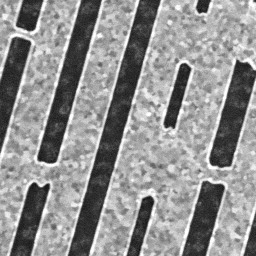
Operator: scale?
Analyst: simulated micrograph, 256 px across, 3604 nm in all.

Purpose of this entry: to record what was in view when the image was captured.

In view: parallel lines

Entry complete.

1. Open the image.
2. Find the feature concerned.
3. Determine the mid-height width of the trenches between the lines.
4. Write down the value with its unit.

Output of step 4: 319 nm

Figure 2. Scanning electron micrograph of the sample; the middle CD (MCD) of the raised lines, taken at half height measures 0.471 um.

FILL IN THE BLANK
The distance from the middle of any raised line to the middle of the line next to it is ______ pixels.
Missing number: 55.3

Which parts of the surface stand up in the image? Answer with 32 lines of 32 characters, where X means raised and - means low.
XXX--XXXXX---XXXX---XXXX--XXXXXX
XX---XXXXX--XXXXX---XXXXX-XXXXXX
XX---XXXX---XXXXX---XXXXXXXXXXXX
XX---XXXX---XXXX---XXXXXXXXXXXXX
XXXXXXXXX---XXXX---XXXXXXXXXXXXX
X---XXXX---XXXXX---XXXXXXXXXXXXX
X---XXXX---XXXX---XXXXXXXXXXXXXX
X---XXXX---XXXX---XXXXXXXXXXX-XX
---XXXXX---XXXX---XXXX--XXXXX---
---XXXX---XXXXX---XXXX--XXXXX---
---XXXX---XXXX---XXXXX--XXXXX---
--XXXXX---XXXX---XXXX--XXXXX----
--XXXX---XXXXX---XXXX--XXXXX---X
--XXXX---XXXX---XXXXX--XXXXX---X
--XXXX---XXXX---XXXX--XXXXX----X
-XXXXX---XXXX---XXXX--XXXXX----X
-XXXX---XXXXX---XXXXXXXXXXX---XX
-XXXX---XXXX---XXXXXXXXXXXX---XX
XXXXX---XXXX---XXXXXXXXXXX----XX
XXXXX--XXXXX---XXXXXXXXXXX---XXX
XXXXXX-XXXXX---XXXXXXXXXXX---XXX
XXXXXXXXXXX---XXXXXXXXXXXXXXXXXX
XXXXXXXXXXX---XXXXXXXXXXXXXXXXXX
XXX---XXXXX---XXXXXXXXXXX---XXXX
XXX---XXXX---XXXXX-XXXXXX---XXXX
XXX---XXXX---XXXX--XXXXX----XXXX
XXX--XXXXX---XXXX--XXXXX---XXXXX
XX---XXXXX--XXXXX--XXXXX---XXXXX
XX---XXXX---XXXXX--XXXXX---XXXX-
XX---XXXX---XXXX--XXXXX----XXXX-
X---XXXXX---XXXX--XXXXX---XXXXX-
X---XXXX---XXXXX--XXXXX---XXXX--